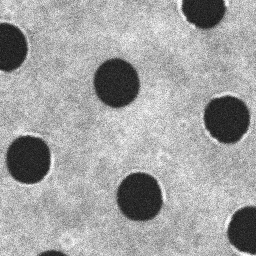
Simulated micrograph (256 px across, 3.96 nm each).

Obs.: holes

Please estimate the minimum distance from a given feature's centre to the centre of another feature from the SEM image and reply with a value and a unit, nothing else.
0.46 um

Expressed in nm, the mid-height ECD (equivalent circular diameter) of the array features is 190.